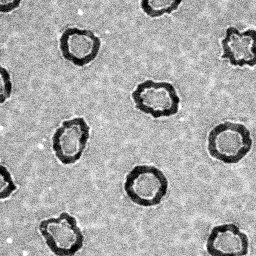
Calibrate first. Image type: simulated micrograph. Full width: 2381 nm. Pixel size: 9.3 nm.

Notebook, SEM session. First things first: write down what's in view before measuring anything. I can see ring-shaped raised bodies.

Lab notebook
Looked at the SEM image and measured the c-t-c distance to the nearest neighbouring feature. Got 810 nanometers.